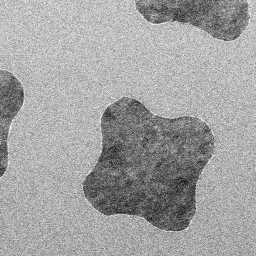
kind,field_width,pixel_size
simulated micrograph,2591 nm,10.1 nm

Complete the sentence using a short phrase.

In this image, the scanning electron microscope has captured raised bodies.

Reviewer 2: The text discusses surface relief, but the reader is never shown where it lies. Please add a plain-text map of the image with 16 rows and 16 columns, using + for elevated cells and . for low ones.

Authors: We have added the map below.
.........+++++++
............++++
..............+.
................
+...............
+...............
+......++.......
+.....+++++++...
+.....+++++++...
+.....+++++++...
......+++++++...
.....+++++++....
.....+++++++....
........++++....
................
................